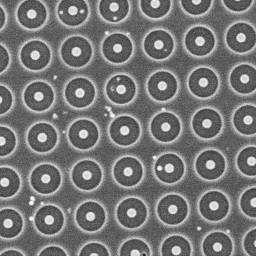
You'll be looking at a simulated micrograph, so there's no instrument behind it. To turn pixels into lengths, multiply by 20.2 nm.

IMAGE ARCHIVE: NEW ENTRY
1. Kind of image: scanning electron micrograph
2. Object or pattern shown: an array of small figures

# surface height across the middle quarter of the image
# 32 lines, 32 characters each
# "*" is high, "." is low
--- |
*....***************************
********************************
**********************.....*****
***..*******.....****.......***.
*......****.......***.......***.
*......****.......***.......***.
........**........***.......****
........***.......***.......****
........***......*****.....*****
*......*****....****************
**....**************************
********************************
***********************....*****
*************....*****......****
***....*****......****.......***
**......***........**........***
*........**........***.......***
*........**........***.......***
*........***.......****.....****
**......*****.....*******.******
**.....********.****************
********************************
*************************..*****
**************....******.....***
****....*****......****.......**
***......***.......****.......**
**.......***........***.......**
**........**........***.......**
**.......****......****......***
**.......****......******...****
***.....*******..***************
*****..*************************